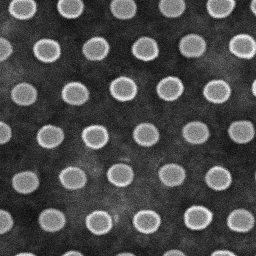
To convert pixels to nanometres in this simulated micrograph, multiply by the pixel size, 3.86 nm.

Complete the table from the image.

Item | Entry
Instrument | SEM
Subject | a regular array of raised bodies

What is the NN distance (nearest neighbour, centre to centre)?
179 nm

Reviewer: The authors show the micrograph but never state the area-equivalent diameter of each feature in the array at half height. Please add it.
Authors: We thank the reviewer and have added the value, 95.3 nanometres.